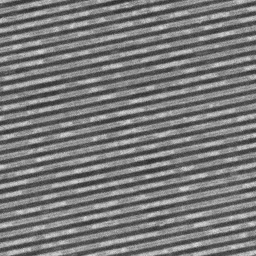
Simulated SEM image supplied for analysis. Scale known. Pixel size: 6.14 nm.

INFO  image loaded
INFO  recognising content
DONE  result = parallel lines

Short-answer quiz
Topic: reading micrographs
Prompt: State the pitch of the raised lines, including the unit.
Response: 58.8 nm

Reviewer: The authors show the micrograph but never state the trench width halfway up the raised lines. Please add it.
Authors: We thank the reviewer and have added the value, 35.4 nm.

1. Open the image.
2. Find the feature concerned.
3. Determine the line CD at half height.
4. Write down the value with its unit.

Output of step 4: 24.1 nm